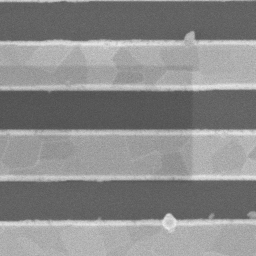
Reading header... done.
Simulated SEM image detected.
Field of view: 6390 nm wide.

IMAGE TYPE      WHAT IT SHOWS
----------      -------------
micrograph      lines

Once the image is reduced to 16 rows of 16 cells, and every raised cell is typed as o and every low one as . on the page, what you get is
................
................
...........oo...
oooooooooooooooo
oooooooooooooooo
oooooo....ooo...
................
................
oooooooooooooooo
oooooooooooooooo
oooooooooooooooo
................
................
................
oooooooooooooooo
oooooooooooooooo